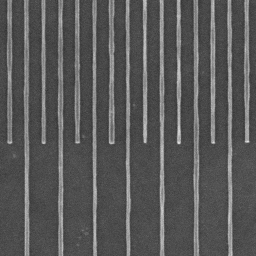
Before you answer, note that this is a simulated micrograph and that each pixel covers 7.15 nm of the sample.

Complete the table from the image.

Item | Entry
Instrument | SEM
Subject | parallel lines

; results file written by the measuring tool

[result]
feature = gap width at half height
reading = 13.7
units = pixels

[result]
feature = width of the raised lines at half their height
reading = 21.4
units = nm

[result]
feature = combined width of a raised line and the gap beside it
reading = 121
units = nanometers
